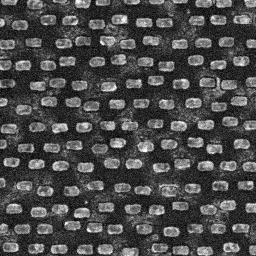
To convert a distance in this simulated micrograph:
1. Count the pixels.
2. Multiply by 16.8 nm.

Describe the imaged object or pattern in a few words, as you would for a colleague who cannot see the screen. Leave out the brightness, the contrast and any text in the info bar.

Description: a regular array of raised bodies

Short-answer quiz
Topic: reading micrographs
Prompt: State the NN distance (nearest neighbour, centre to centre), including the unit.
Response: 0.345 µm